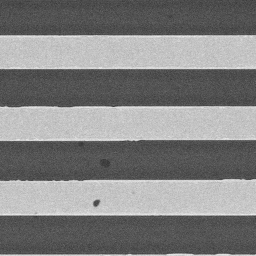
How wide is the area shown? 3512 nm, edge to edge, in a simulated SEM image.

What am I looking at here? lines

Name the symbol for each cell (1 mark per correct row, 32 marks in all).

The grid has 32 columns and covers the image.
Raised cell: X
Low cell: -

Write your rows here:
--------------------------------
--------------------------------
--------------------------------
--------------------------------
--------------------------------
XXXXXXXXXXXXXXXXXXXXXXXXXXXXXXXX
XXXXXXXXXXXXXXXXXXXXXXXXXXXXXXXX
XXXXXXXXXXXXXXXXXXXXXXXXXXXXXXXX
XXXXXXXXXXXXXXXXXXXXXXXXXXXXXXXX
--------------------------------
--------------------------------
--------------------------------
--------------------------------
XXXXXXXXXXXXXXXXXXXXXXXXXXXXXXXX
XXXXXXXXXXXXXXXXXXXXXXXXXXXXXXXX
XXXXXXXXXXXXXXXXXXXXXXXXXXXXXXXX
XXXXXXXXXXXXXXXXXXXXXXXXXXXXXXXX
XXXXXXXXXXXXXXXXXX--------------
--------------------------------
--------------------------------
--------------------------------
--------------------------------
----------------------------XX-X
XXXXXXXXXXXXXXXXXXXXXXXXXXXXXXXX
XXXXXXXXXXXXXXXXXXXXXXXXXXXXXXXX
XXXXXXXXXXXXXXXXXXXXXXXXXXXXXXXX
XXXXXXXXXXXXXXXXXXXXXXXXXXXXXXXX
--------------------------------
--------------------------------
--------------------------------
--------------------------------
--------------------------------